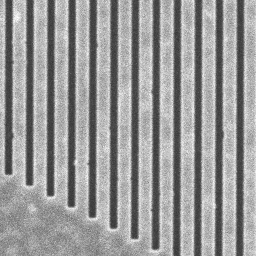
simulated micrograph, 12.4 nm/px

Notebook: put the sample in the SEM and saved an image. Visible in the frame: parallel lines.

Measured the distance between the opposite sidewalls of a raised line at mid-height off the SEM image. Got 166 nm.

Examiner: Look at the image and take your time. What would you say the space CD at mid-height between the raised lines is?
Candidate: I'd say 94.6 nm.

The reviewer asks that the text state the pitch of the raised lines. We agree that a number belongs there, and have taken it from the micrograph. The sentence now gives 261 nm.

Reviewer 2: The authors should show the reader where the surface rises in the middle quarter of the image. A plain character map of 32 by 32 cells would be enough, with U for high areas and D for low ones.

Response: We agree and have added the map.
UDDUUUDDUUUDDDUUUDDUUUDDUUUDDUUU
UDDUUUDDUUUDDDUUUDDUUUDDUUUDDUUU
UDDUUUDDUUUDDDUUUDDUUUDDUUUDDUUU
UDDUUUDDUUUDDDUUUDDUUUDDUUUDDUUU
UDDUUUDDUUUDDDUUUDDUUUDDUUUDDUUU
UDDUUUDDUUUDDDUUUDDUUUDDUUUDDUUU
UDDUUUDDUUUDDDUUUDDUUUDDUUUDDUUU
UDDUUUDDUUUDDDUUUDDUUUDDUUUDDUUU
UDDUUUDDUUUDDDUUUDDUUUDDUUUDDUUU
UDDUUUDDUUUDDDUUUDDUUUDDUUUDDUUU
UDDUUUDDUUUDDDUUUDDUUUDDUUUDDUUU
UDDUUUDDUUUDDDUUUDDUUUDDUUUDDUUU
UDDUUUDDUUUDDDUUUDDUUUDDUUUDDUUU
UDDUUUDDUUUDDDUUUDDUUUDDUUUDDUUU
UDDUUUDDUUUDDDUUUDDUUUDDUUUDDUUU
UDDUUUDDUUUDDDUUUDDUUUDDUUUDDUUU
UDDUUUDDUUUDDDUUUDDUUUDDUUUDDUUU
UDDUUUDDUUUDDDUUUDDUUUDDUUUDDUUU
UDDUUUDDUUUDDDUUUDDUUUDDUUUDDUUU
UDDUUUDDUUUDDDUUUDDUUUDDUUUDDUUU
UDDUUUDDUUUDDDUUUDDUUUDDUUUDDUUU
UDDUUUDDUUUDDDUUUDDUUUDDUUUDDUUU
UDDUUUDDUUUDDDUUUDDUUUDDUUUDDUUU
UDDUUUDDUUUDDDUUUDDUUUDDUUUDDUUU
UDDUUUDDUUUDDDUUUDDUUUDDUUUDDUUU
UDDUUUDDUUUDDDUUUDDUUUDDUUUDDUUU
UDDUUUDDUUUDDDUUUDDUUUDDUUUDDUUU
UDDUUUDDUUUDDDUUUDDUUUDDUUUDDUUU
UDDUUUDDUUUDDDUUUDDUUUDDUUUDDUUU
UDDUUUDDUUUDDDUUUDDUUUDDUUUDDUUU
UDDUUUDDUUUDDDUUUDDUUUDDUUUDDUUU
UDDUUUDDUUUDDDUUUDDUUUDDUUUDDUUU